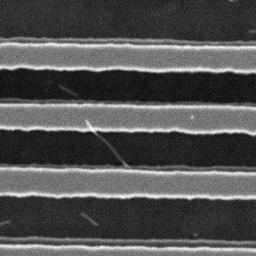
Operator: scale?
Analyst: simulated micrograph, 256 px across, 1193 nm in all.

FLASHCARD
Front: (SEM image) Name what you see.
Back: lines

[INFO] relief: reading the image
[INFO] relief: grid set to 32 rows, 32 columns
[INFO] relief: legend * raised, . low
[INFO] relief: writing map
................................
................................
................................
................................
................................
****.**.........................
********************************
********************************
**..****************************
................................
................................
................................
................................
********************************
********************************
********************************
.......................*********
................................
................................
................................
................................
***********************...*.....
********************************
********************************
......***...*****.**************
................................
................................
................................
................................
................................
................................
********************************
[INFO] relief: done